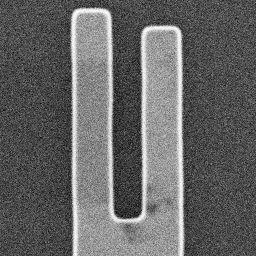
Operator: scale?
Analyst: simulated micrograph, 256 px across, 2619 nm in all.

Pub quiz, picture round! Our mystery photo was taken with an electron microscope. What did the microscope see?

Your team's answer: groups of lines, slits or small figures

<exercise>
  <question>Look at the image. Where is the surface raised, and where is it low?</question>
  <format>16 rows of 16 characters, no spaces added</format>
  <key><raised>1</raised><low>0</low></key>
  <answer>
0000000000000000
0000011000000000
0000011001100000
0000011001100000
0000011001100000
0000011001100000
0000011001100000
0000011001100000
0000011001100000
0000011001100000
0000011001100000
0000011001100000
0000011001100000
0000011001100000
0000011111100000
0000011111100000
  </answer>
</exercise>